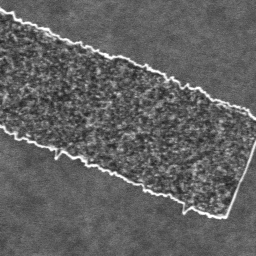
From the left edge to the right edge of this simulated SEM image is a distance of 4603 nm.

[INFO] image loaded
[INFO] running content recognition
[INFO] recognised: one or a few lines or trenches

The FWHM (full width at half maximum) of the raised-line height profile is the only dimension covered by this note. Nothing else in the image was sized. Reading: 1950 nm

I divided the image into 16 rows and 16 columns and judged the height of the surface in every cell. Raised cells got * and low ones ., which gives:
................
**..............
****............
*******.........
**********......
************....
**************..
****************
.***************
...*************
......*********.
........*******.
...........****.
.............*..
................
................